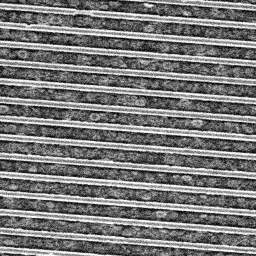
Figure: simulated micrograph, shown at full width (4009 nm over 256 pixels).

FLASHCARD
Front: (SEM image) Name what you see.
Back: parallel lines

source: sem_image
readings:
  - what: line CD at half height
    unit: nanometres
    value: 74.2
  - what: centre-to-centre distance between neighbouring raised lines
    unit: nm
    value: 292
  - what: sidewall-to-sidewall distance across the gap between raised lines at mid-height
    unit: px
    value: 14.3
